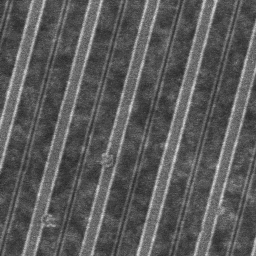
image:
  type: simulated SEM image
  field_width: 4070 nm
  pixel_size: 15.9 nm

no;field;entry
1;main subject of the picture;parallel lines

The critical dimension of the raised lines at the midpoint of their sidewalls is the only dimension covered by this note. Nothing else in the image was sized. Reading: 0.319 microns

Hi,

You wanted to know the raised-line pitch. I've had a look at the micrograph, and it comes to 27.7 px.